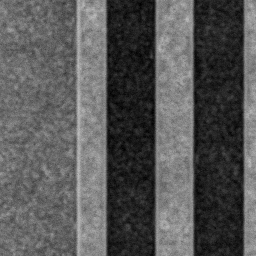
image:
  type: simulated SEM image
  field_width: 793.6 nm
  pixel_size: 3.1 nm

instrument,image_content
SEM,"one or a few lines or trenches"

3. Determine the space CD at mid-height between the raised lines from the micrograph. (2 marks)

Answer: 155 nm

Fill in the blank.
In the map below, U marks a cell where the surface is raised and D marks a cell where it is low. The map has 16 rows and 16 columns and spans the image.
DDDDDUUDDDUUDDDU
DDDDDUUDDDUUDDDU
DDDDDUUDDDUUDDDU
DDDDDUUDDDUUDDDU
DDDDDUUDDDUUDDDU
DDDDDUUDDDUUDDDU
DDDDDUUDDDUUDDDU
DDDDDUUDDDUUDDDU
DDDDDUUDDDUUDDDU
DDDDDUUDDDUUDDDU
DDDDDUUDDDUUDDDU
DDDDDUUDDDUUDDDU
DDDDDUUDDDUUDDDU
DDDDDUUDDDUUDDDU
DDDDDUUDDDUUDDDU
DDDDDUUDDDUUDDDU